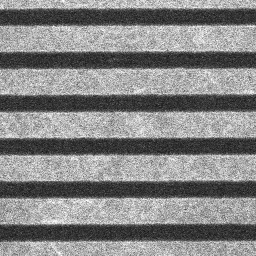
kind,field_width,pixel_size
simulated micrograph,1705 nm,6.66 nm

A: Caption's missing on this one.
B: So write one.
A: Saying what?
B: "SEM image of parallel lines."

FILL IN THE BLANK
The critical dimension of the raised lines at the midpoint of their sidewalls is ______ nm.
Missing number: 189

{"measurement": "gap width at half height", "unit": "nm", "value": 101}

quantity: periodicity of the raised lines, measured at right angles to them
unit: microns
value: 0.287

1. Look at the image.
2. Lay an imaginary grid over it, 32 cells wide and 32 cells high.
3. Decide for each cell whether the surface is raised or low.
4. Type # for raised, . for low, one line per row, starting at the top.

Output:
################################
................................
................................
################################
################################
################################
################################
................................
..##..........##.....##.......#.
################################
################################
################################
................................
................................
################################
################################
################################
................................
................................
################################
################################
################################
################################
................................
................................
################################
################################
################################
................................
................................
################################
################################